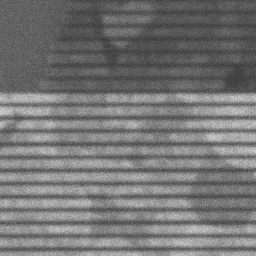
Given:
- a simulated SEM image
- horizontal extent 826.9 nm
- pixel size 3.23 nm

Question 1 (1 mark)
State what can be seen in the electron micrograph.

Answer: parallel lines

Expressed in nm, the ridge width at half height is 26.3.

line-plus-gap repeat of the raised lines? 42.4 nanometers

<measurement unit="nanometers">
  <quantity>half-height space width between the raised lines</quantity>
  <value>15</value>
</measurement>